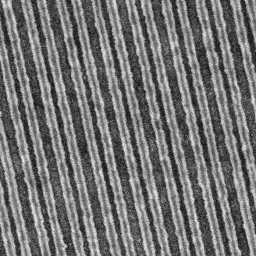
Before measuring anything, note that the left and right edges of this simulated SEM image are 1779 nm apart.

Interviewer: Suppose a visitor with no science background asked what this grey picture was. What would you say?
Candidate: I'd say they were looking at parallel lines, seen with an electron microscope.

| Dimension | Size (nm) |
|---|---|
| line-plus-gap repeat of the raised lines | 118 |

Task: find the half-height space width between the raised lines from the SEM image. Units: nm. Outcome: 62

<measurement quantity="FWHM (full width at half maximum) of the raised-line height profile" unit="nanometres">48.4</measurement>